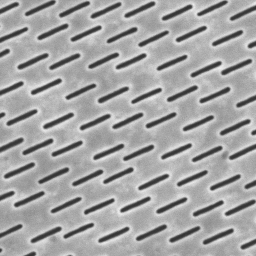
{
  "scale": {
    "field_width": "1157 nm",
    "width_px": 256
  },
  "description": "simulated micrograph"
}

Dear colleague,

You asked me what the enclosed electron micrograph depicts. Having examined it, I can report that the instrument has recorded a regular array of holes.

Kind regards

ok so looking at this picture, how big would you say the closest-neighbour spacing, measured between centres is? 134 nanometres